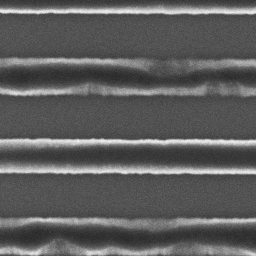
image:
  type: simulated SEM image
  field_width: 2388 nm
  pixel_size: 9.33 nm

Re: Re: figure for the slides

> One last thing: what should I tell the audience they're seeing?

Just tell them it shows lines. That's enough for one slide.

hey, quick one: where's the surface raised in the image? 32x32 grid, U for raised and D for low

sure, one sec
UUUUUUUUUUUUUUUUUUUUUUUUUUUUUUUU
DDDDUDDDDDDDDDDDDDDDDDDDDDDDDDDU
DDDDDDDDDDDDDDDDDDDDDDDDDDDDDDDD
DDDDDDDDDDDDDDDDDDDDDDDDDDDDDDDD
DDDDDDDDDDDDDDDDDDDDDDDDDDDDDDDD
DDDDDDDDDDDDDDDDDDDDDDDDDDDDDDDD
DDDDDDDDDDDDDDDDDDDDDDDDDDDDDDDD
DDDDDDDDDDDDDDDDDDDDDDDDDDDDDDDD
UUUUUUUUUUUUUUUUUUUDDDDUUUUUUUUU
UUUUUUUUUUUUUUUUUUUUUUUUUUUUUUUU
UUUUUUUUUUUUUUUUUUUUUUUUUUUUUUUU
DUUUUUDDDDDDDDDDDUUDDDDDDDDDDDDD
DDDDDDDDDDDDDDDDDDDDDDDDDDDDDDDD
DDDDDDDDDDDDDDDDDDDDDDDDDDDDDDDD
DDDDDDDDDDDDDDDDDDDDDDDDDDDDDDDD
DDDDDDDDDDDDDDDDDDDDDDDDDDDDDDDD
DDDDDDDDDDDDDDDDDDDDDDDDDDDDDDDD
DDDDDDDDDDDDDDDDDDDDDDDDDDDDDDDD
UUUUUUUUUUUUUUUUUUUUUUUUUUUUUUUU
UUUUUUUUUUUUUUUUUUUUUUUUUUUUUUUU
UUUUUUUUUUUUUUUUUUUUUUUUUUUUUUUU
DDDDDDDDDDDDDDDDDDDDDDDDDDDUDUDU
DDDDDDDDDDDDDDDDDDDDDDDDDDDDDDDD
DDDDDDDDDDDDDDDDDDDDDDDDDDDDDDDD
DDDDDDDDDDDDDDDDDDDDDDDDDDDDDDDD
DDDDDDDDDDDDDDDDDDDDDDDDDDDDDDDD
DDDDDDDDDDDDDDDDDDDDDDDDDDDDDDDD
DDDDUDDDDDDDDDDDDDDDDDDDDDDDDDDD
UUUUUUUUUUUUUUUUUUUUUUUUUUUUUUUU
UUUUUUUUUUUUUUUUUUUUUUUUUUUUUUUU
UUUUUUUUUUUUUUUUUUUUUUUUUUUUUUUU
DDDUUDDDDDDUDDDDUUUDDDDDDDDDDDUU